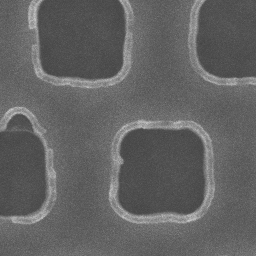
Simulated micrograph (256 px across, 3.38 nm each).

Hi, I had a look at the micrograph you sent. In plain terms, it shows holes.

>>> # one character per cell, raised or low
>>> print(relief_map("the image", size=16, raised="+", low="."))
++......+++++...
++......++++....
++......++++....
++......++++....
+++....++++++...
++++++++++++++++
++++++++++++++++
+.++++++++++++++
..++++++....++++
...+++++.....+++
...+++++.....+++
...++++......+++
...++++......+++
..++++++++++++++
++++++++++++++++
++++++++++++++++